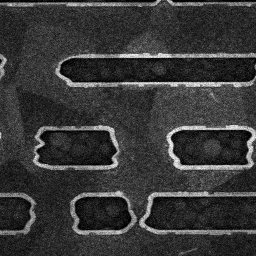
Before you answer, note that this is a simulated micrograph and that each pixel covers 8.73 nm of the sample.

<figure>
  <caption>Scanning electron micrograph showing one or a few lines or trenches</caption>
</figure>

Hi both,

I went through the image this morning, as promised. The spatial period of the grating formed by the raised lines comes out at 75.3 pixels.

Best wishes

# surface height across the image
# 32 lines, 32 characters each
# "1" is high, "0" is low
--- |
11111111111111110011111111111111
11111111111111111111111111111111
11111111111111111111111111111111
11111111111111111111111111111111
11111111111111111111111111111111
11111111111111111111111111111111
11111111111111111111111111111111
11111111000000000000000000000000
11111110000000000000000000000000
11111111000000000000000000000000
11111111101111111111111111111111
11111111111111111111111111111111
11111111111111111111111111111111
11111111111111111111111111111111
11111111111111111111111111111111
11111111111111111111111111111111
11111000000000111111110000000001
11111000000000111111100000000001
11111000000000011111110000000001
11111000000000111111110000000001
11111100000000111111110000000001
11111111111111111111111111111111
11111111111111111111111111111111
11111111111111111111111111111111
10111111111000011111000000000000
00001111100000001110000000000000
00001111100000001110000000000000
00001111110000001100000000000000
00011111110000001110000000000000
11111111111111111111111111111111
11111111111111111111111111111111
11111111111111111111111111111111